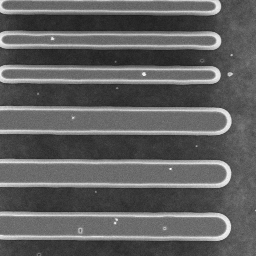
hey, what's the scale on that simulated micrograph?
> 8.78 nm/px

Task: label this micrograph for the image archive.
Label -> groups of lines, slits or small figures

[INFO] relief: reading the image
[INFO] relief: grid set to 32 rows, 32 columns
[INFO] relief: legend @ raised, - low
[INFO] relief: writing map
@@@@@@@@@@@@@@@@@@@@@@@@@@@-----
-@@@@@@@@@@@@@@@@@@@@@@@@@@-----
--------------------------------
--------------------------------
@@@@@@@@@@@@@@@@@@@@@@@@@@@-----
@@@@@@@@@@@@@@@@@@@@@@@@@@@-----
--------------------------------
--------------------------------
@@@@@@@@@@@@@@@@@@@@@@@@--------
@@@@@@@@@@@@@@@@@@@@@@@@@@@-----
--------------------------------
--------------------------------
--------------------------------
--------------------------------
@@@@@@@@@@@@@@@@@@@@@@@@@@@@----
@@@@@@@@@@@@@@@@@@@@@@@@@@@@@---
---@@@@@@@@@@@@@@@@@@@@@@@@@----
--------------------------------
--------------------------------
--------------------------------
@@@@@@@@@@@@@@@@@@@@@@@@@@@@----
@@@@@@@@@@@@@@@@@@@@@@@@@@@@@---
@@@@@@@@@@@@@@@@@@@@@@@@@@@@----
--------------------------------
--------------------------------
--------------------------------
--------------------------------
@@@@@@@@@@@@@@@@@@@@@@@@@@@@----
@@@@@@@@@@@@@@@@@@@@@@@@@@@@@---
@@@@@@@@@@@@@@@@@@@@@@@@@@@@----
--------------------------------
--------------------------------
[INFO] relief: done